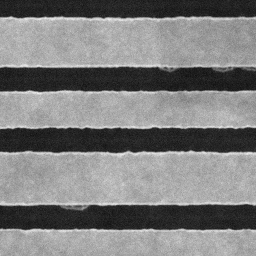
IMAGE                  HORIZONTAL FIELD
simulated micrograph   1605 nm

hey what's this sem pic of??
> lines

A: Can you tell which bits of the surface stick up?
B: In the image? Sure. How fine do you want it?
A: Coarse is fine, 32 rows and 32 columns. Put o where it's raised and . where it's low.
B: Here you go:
................................
................................
oooooooooooooooooooooooooooooooo
oooooooooooooooooooooooooooooooo
oooooooooooooooooooooooooooooooo
oooooooooooooooooooooooooooooooo
oooooooooooooooooooooooooooooooo
oooooooooooooooooooooooooooooooo
................................
................................
................................
.o.o...oooo.oooo.o..o..oooooo.oo
oooooooooooooooooooooooooooooooo
oooooooooooooooooooooooooooooooo
oooooooooooooooooooooooooooooooo
oooooooooooooooooooooooooooooooo
................................
................................
................................
oooooooooooooooooooooooooooooooo
oooooooooooooooooooooooooooooooo
oooooooooooooooooooooooooooooooo
oooooooooooooooooooooooooooooooo
oooooooooooooooooooooooooooooooo
oooooooooooooooooooooooooooooooo
oooooooooooooooooooooooooo.ooooo
................................
................................
................................
oooooooooooooooooooooooooooooooo
oooooooooooooooooooooooooooooooo
oooooooooooooooooooooooooooooooo